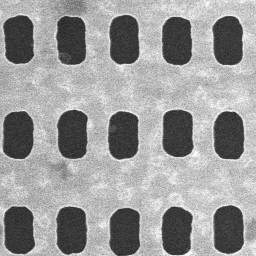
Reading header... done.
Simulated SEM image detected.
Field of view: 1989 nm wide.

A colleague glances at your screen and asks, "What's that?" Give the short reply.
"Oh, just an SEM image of a regular array of holes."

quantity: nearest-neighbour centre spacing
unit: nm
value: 402